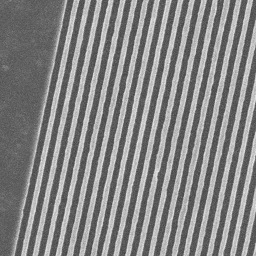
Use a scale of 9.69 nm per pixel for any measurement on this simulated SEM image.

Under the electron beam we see parallel lines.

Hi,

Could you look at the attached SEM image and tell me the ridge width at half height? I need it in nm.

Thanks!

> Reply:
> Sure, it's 42.7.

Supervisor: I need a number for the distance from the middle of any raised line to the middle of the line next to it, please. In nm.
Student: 110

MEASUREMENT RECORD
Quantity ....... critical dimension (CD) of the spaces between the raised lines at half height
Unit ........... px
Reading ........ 6.98